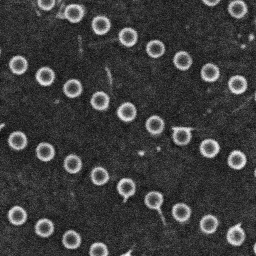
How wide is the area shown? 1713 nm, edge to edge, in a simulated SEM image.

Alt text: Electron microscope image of a regular array of raised bodies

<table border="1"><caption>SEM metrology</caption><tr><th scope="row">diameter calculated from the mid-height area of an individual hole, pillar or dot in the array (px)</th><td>16.7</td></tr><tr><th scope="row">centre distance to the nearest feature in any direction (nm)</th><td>198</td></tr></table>